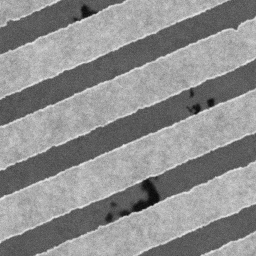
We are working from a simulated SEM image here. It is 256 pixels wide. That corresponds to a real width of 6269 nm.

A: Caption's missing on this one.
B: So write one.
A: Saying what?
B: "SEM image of one or a few lines or trenches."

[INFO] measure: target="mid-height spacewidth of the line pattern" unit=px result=26.6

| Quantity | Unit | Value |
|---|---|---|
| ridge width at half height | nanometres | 956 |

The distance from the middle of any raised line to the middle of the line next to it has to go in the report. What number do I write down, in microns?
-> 1.61